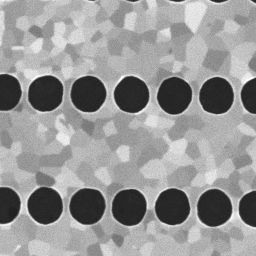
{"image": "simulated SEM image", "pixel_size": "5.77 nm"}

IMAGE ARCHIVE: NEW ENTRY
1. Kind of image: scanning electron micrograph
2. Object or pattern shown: a regular array of holes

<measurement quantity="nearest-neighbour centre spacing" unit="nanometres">241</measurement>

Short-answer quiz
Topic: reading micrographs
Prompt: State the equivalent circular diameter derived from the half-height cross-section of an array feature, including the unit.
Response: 207 nm